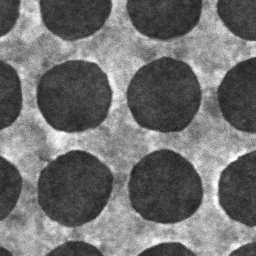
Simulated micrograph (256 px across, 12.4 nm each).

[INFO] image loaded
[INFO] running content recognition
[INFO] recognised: holes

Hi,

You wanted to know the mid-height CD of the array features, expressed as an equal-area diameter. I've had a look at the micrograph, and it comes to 938 nm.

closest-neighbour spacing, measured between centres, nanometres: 1120